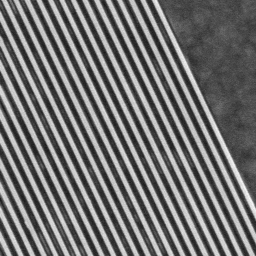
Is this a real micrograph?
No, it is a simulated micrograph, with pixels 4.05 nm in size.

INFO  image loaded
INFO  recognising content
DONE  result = parallel lines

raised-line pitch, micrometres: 0.0424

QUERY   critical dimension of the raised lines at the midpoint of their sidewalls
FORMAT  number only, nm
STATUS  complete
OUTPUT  18.3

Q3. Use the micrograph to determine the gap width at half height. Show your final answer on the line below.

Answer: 0.0257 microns